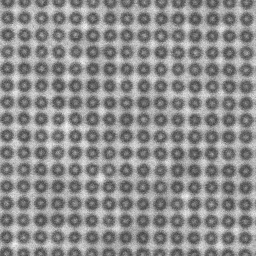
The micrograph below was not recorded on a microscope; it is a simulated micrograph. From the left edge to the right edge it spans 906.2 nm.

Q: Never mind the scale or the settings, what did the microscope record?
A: a regular array of ring-shaped grooves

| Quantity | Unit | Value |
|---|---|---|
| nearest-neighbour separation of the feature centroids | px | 16.8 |